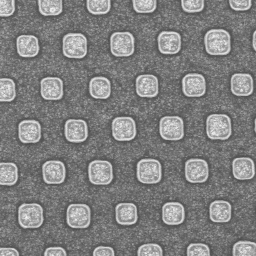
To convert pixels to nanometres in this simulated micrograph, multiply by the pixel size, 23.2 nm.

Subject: a regular array of raised bodies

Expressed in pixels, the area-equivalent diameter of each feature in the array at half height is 23.3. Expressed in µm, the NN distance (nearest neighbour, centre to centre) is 1.09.